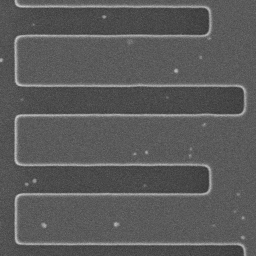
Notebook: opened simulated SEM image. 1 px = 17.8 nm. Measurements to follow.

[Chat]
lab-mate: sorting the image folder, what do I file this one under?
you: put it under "groups of lines, slits or small figures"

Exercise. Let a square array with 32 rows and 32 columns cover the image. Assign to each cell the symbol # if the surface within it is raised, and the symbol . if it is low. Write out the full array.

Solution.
..##############################
..........................######
..........................######
..........................######
...#############################
..##############################
..##############################
..##############################
..##############################
..##############################
..##############################
..............................##
...............................#
..............................##
..##############################
..##############################
..##############################
..##############################
..##############################
..##############################
..##############################
..........................######
..........................######
..........................######
..##############################
..##############################
..##############################
..##############################
..##############################
..##############################
...#############################
..............................##